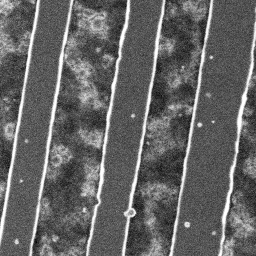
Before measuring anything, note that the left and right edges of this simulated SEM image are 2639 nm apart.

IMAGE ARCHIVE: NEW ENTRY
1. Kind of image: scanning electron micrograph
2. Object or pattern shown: one or a few lines or trenches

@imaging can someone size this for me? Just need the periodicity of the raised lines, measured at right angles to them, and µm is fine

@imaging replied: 0.924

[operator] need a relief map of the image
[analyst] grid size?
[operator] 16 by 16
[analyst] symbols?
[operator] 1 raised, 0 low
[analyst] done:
0011000011000111
0011000011000111
0011000011000111
0011000111000111
0011000111001111
0111000110001110
0110000110001110
0110000110001110
0110000110001110
0110001110001110
0110001110001110
0110001100011100
1100001100011100
1100001100011100
1100001100011100
1100011100011100